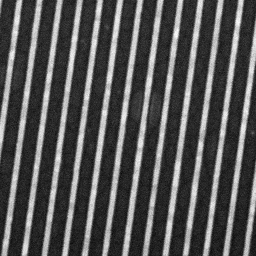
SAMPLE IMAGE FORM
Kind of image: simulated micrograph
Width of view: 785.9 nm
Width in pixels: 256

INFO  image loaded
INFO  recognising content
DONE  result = parallel lines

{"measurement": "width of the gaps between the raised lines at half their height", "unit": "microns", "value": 0.0498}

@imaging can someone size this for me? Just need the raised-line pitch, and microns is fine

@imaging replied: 0.0612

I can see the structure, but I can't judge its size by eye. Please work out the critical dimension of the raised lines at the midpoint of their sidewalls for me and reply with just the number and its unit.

11 nanometers